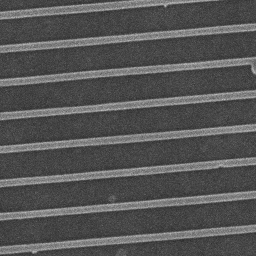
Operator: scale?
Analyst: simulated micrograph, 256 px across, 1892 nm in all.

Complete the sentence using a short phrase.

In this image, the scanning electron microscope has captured parallel lines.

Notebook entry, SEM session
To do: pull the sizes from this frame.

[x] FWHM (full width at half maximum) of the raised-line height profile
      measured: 51.6 nm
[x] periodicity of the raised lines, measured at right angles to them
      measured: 247 nm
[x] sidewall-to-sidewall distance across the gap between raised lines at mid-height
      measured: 200 nm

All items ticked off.